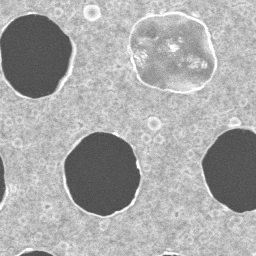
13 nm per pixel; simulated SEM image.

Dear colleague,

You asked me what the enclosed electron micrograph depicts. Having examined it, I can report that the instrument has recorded holes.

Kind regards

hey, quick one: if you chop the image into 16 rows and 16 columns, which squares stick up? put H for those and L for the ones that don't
HHHHHHHHHHHHHHHH
HLLLHHHHHHHHHHHH
LLLLHHHHHHHHHHHH
LLLLHHHHHHHHHHHH
LLLLHHHHHHHHHHHH
HLLLHHHHHHHHHHHH
HHHHHHHHHHHHHHHH
HHHHHHHHHHHHHHHH
HHHHHLLHHHHHHHLL
HHHHLLLLHHHHHLLL
HHHHLLLLLHHHHLLL
HHHHLLLLLHHHHLLL
HHHHHLLLHHHHHHLL
HHHHHHHHHHHHHHHH
HHHHHHHHHHHHHHHH
HHHHHHHHHHHHHHHH